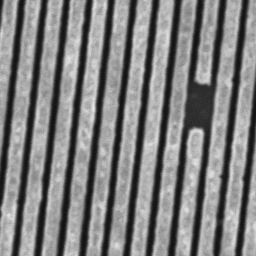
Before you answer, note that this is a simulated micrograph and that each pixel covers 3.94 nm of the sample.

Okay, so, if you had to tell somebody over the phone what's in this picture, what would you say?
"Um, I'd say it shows parallel lines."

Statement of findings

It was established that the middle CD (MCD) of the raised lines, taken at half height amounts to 58.2 nm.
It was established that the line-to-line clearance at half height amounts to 26.9 nanometres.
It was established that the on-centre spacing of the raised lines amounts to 87.4 nm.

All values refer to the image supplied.